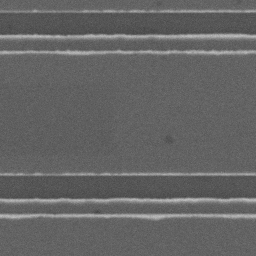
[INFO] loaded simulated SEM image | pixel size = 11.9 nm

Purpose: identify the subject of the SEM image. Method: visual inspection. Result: lines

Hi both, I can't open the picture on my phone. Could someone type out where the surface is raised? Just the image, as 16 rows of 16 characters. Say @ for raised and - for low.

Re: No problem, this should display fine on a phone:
@@@@@@@@@@@@@@@@
----------------
----------------
@@@@@@@@@@@@@@@@
@@@@@@@@@@@@@@@@
@@@@@@@@@@@@@@@@
@@@@@@@@@@@@@@@@
@@@@@@@@@@@@@@@@
@@@@@@@@@@@@@@@@
@@@@@@@@@@@@@@@@
@@@@@@@@@@@@@@@@
----------------
----------------
@@@@@@@@@@@@@@@@
@@@@@@@@@@@@@@@@
@@@@@@@@@@@@@@@@